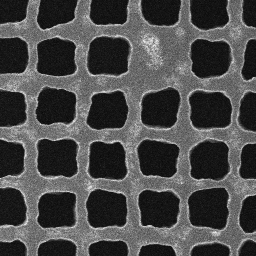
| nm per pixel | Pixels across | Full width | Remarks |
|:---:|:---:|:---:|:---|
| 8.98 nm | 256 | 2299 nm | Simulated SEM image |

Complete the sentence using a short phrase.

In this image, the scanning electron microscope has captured a regular array of holes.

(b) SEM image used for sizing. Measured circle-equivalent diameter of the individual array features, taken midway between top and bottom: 367 nanometers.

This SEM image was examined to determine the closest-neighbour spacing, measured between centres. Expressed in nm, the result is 441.